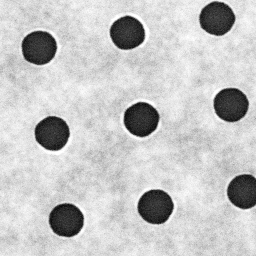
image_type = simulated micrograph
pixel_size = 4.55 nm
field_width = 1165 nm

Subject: a regular array of holes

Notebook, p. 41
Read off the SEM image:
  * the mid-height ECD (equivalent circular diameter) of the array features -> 0.165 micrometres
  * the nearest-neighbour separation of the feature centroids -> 398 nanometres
